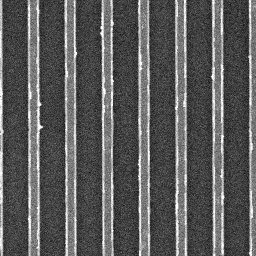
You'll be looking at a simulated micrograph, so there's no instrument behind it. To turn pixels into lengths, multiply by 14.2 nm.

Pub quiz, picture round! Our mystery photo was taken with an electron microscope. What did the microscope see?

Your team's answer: parallel lines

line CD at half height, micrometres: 0.144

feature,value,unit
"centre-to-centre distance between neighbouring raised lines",524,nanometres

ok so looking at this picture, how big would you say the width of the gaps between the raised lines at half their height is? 379 nm